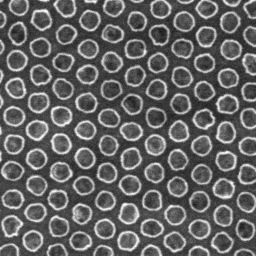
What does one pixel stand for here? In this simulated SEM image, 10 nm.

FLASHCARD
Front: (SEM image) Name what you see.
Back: a regular array of raised bodies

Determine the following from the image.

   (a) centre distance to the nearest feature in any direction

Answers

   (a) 264 nanometers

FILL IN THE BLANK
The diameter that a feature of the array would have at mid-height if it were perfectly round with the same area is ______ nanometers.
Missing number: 194